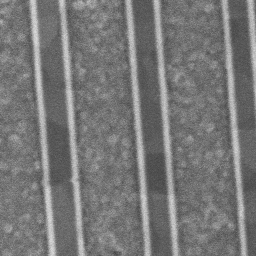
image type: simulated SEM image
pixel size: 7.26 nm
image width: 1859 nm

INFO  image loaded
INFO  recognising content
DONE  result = one or a few lines or trenches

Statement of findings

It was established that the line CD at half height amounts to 206 nanometers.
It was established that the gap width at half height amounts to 481 nanometres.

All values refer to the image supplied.